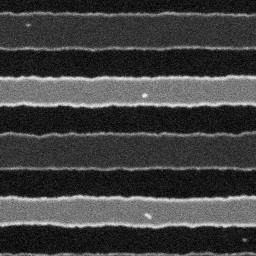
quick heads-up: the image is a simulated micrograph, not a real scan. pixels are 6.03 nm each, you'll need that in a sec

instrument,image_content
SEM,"lines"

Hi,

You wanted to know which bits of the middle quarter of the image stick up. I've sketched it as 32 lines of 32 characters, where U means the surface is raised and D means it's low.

DDDDDDDDDDDDDDDDDDDDDDDDDDDDDDDD
DDDDDDDDDDDDDDDDDDDDDDDDDDDDDDDD
DDDDDDDDDDDDDDDDDDDDDDDDDDDDDDDD
UUUUUDDDUUUUUUUUUUDUUDDUUUUUUUUU
UUUUUUUUUUUUUUUUUUUUUUUUUUUUUUUU
UUUUUUUUUUUUUUUUUUUUUUUUUUUUUUUU
UUUUUUUUUUUUUUUUUUUUUUUUUUUUUUUU
UUUUUUUUUUUUUUUUUUUUUUUUUUUUUUUU
UUUUUUUUUUUUUUUUUUUUUUUUUUUUUUUU
UUUUUUUUUUUUUUUUUUUUUUUUUUUUUUUU
DDUUDUUUUUDDDDDDDDDDDDDDDDDUDDDU
DDDDDDDDDDDDDDDDDDDDDDDDDDDDDDDD
DDDDDDDDDDDDDDDDDDDDDDDDDDDDDDDD
DDDDDDDDDDDDDDDDDDDDDDDDDDDDDDDD
DDDDDDDDDDDDDDDDDDDDDDDDDDDDDDDD
DDDDDDDDDDDDDDDDDDDDDDDDDDDDDDDD
DDDDDDDDDDDDDDDDDDDDDDDDDDDDDDDD
DUUUUUUUUUUUUUUUUUUUUUUDUUUUDDDD
UUUUUUUUUUUUUUUUUUUUUUUUUUUUUUUU
UUUUUUUUUUUUUUUUUUUUUUUUUUUUUUUU
UUUUUUUUUUUUUUUUUUUUUUUUUUUUUUUU
UUUUUUUUUUUUUUUUUUUUUUUUUUUUUUUU
UUUUUUUUUUUUUUUUUUUUUUUUUUUUUUUU
UUUUUUUUUUUUUUUUUUUUUUUUUUUUUUUU
UUUUUUUUUUUUUUUUUUUUUUUUUUUUUUUU
UUUUUUUUUUUUUUUUUUUUUUUUUUUUUUUU
DDDDDDDDDDDDDDDDDDDDDDDDDDDDDDDD
DDDDDDDDDDDDDDDDDDDDDDDDDDDDDDDD
DDDDDDDDDDDDDDDDDDDDDDDDDDDDDDDD
DDDDDDDDDDDDDDDDDDDDDDDDDDDDDDDD
DDDDDDDDDDDDDDDDDDDDDDDDDDDDDDDD
DDDDDDDDDDDDDDDDDDDDDDDDDDDDDDDD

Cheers